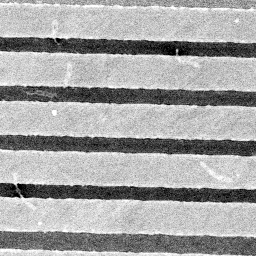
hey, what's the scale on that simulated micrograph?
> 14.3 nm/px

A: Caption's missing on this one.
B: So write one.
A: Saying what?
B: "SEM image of lines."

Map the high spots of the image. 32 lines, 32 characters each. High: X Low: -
XX------------------------------
XXXXXXXXXXXXXXXXXXXXXXXXXXXXXXXX
XXXXXXXXXXXXXXXXXXXXXXXXXXXXXXXX
XXXXXXXXXXXXXXXXXXXXXXXXXXXXXXXX
XXXXXXXXXXXXXXXXXXXXXXXXXXXXXXXX
--------------------------------
XX------------------------------
XXXXXXXXXXXXXXXXXXXXXXXXXXXXXXXX
XXXXXXXXXXXXXXXXXXXXXXXXXXXXXXXX
XXXXXXXXXXXXXXXXXXXXXXXXXXXXXXXX
XXXXXXXXXXXXXXXXXXXXXXXXXXXXXXXX
--------------------------------
--------------------------------
XXXXXXXXXXXXXXXXXXXXXXXXXXXXXXXX
XXXXXXXXXXXXXXXXXXXXXXXXXXXXXXXX
XXXXXXXXXXXXXXXXXXXXXXXXXXXXXXXX
XXXXXXXXXXXXXXXXXXXXXXXXXXXXXXXX
--------------------------------
--------------------------------
XXXXXXXXXXXXXXXXXXXXXXXXXX------
XXXXXXXXXXXXXXXXXXXXXXXXXXXXXXXX
XXXXXXXXXXXXXXXXXXXXXXXXXXXXXXXX
XXXXXXXXXXXXXXXXXXXXXXXXXXXXXXXX
-----------------------XXXXXXXXX
--------------------------------
XXXXXXXXXXXXXXXXXXXXXXXXXXXXXXXX
XXXXXXXXXXXXXXXXXXXXXXXXXXXXXXXX
XXXXXXXXXXXXXXXXXXXXXXXXXXXXXXXX
XXXXXXXXXXXXXXXXXXXXXXXXXXXXXXXX
------------------------------XX
--------------------------------
XXXXXXXXXXXX--------------------